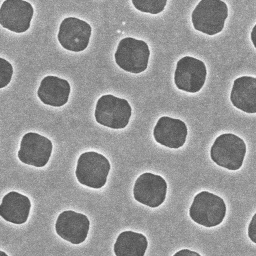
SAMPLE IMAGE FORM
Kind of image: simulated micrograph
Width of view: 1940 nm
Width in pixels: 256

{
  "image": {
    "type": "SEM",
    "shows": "a regular array of holes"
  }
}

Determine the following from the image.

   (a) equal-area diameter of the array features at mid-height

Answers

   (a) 264 nanometres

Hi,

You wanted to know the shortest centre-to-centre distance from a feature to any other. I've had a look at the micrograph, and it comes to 460 nm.